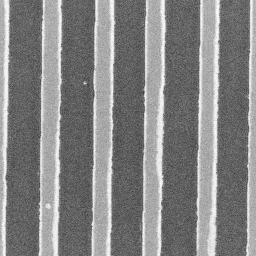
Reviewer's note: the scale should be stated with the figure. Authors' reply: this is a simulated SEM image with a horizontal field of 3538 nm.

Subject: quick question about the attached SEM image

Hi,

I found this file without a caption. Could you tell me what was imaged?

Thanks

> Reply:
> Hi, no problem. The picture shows lines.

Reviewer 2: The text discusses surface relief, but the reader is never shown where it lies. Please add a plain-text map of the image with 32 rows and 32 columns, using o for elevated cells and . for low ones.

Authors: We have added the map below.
o....oo.....oo....oo.....oo....o
o....oo.....oo....oo.....oo....o
o....oo.....oo....oo.....oo....o
o....oo.....oo....oo.....oo....o
o....oo.....oo....oo.....oo....o
o....oo.....oo....oo.....oo....o
o....oo.....oo....oo.....oo....o
o....oo.....oo....oo.....oo....o
o....oo.....oo....oo.....oo....o
o....oo.....oo....oo.....oo....o
o....oo.....oo....oo.....oo....o
o....oo.....oo....oo.....oo....o
o....oo.....oo....oo.....oo....o
o....oo.....oo....oo.....oo....o
o....oo.....oo....oo.....oo....o
o....oo.....oo....oo.....oo....o
o....oo.....oo....oo.....oo....o
o....oo.....oo....oo.....oo....o
o....oo.....oo....oo.....oo....o
o....oo.....oo....oo.....oo....o
o....oo.....oo....oo.....oo....o
o....oo.....oo....oo.....oo....o
o....oo.....oo....oo.....oo....o
o....oo.....oo....oo.....oo....o
o....oo.....oo....oo.....oo....o
o....oo.....oo....oo.....oo....o
.....oo.....oo....oo.....oo....o
.....oo.....oo....oo.....oo....o
.....oo.....oo....oo.....oo....o
.....oo.....oo....oo.....oo....o
.....oo.....o.....oo.....o.....o
.....oo.....oo....oo.....o.....o